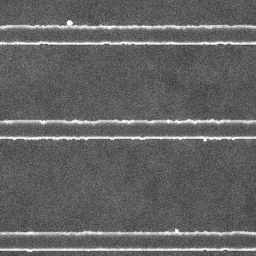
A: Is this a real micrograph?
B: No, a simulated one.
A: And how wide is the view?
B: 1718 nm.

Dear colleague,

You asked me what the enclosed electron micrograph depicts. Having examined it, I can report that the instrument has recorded lines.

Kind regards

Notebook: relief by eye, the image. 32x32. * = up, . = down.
................................
................................
................................
********************************
********************************
................................
................................
................................
................................
................................
................................
................................
................................
................................
................................
********************************
********************************
................................
................................
................................
................................
................................
................................
................................
................................
................................
................................
................................
................................
********************************
********************************
................................